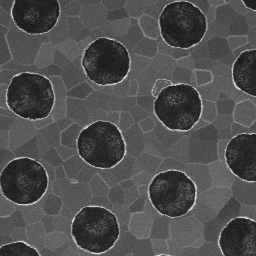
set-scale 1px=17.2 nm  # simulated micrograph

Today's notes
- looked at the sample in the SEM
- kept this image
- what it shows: holes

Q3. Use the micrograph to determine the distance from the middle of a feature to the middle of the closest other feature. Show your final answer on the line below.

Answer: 1430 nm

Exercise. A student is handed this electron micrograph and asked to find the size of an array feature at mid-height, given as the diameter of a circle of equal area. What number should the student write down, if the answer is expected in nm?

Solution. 811